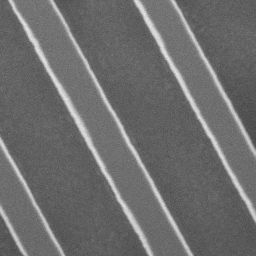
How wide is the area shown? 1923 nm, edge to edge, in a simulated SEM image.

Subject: lines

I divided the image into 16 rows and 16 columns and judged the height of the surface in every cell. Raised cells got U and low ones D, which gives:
DUUUDDDDDUUDDDDD
DUUUDDDDDUUUDDDD
DDUUUDDDDDUUDDDD
DDUUUDDDDDUUUDDD
DDDUUUDDDDDUUDDD
DDDDUUDDDDDUUUDD
DDDDUUUDDDDDUUDD
DDDDDUUDDDDDUUUD
DDDDDUUUDDDDDUUD
DDDDDDUUDDDDDDUU
UDDDDDUUUDDDDDUU
UUDDDDDUUUDDDDDU
UUDDDDDUUUDDDDDU
UUUDDDDDUUUDDDDD
DUUDDDDDDUUDDDDD
DUUUDDDDDUUUDDDD